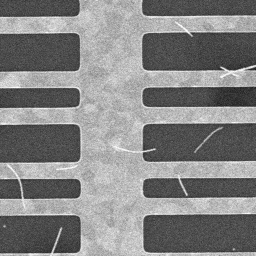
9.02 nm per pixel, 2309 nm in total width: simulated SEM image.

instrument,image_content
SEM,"groups of lines, slits or small figures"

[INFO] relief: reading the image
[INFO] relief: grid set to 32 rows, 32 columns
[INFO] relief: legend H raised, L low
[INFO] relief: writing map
LLLLLLLLLLHHHHHHHHLLLLLLLLLLLLLL
LLLLLLLLLLHHHLHHHHLLLLLLLLLLLLLL
HHHHHHHHHHHHHHHHHHHHHHHHHHHHHHHH
HHHHHHHHHHHHHHHHHHHHHHHHHHHHHHHH
LLLLLLLLLLHHHHHHHHLLLLLLLLLLLLLL
LLLLLLLLLLHHHHHHHHLLLLLLLLLLLLLL
LLLLLLLLLLHHHHHHHHLLLLLLLLLLLLLL
LLLLLLLLLLHHHHHHHHLLLLLLLLLLLLLL
LLLLLLLLLLHHHHHHHHLLLLLLLLLLLLLL
HHHHHHHHHHHHHHHHHHHHHHHHHHHHHHHH
HHHHHHHHHHHHHHHHHHHHHHHHHHHHHHHH
LLLLLLLLLLHHHHHHHHLLLLLLLLLLLLLL
LLLLLLLLLLHHHHHHHHLLLLLLLLLLLLLL
LLLLLLLLLHHHHHHHHHHLLLHHHHHHHHHH
HHHHHHHHHHHHHHHHHHHHHHHHHHHHHHHH
LLLLLLLLLHHHHHHHHHLLLLLLLLLLLLLL
LLLLLLLLLLHHHHHHHHLLLLLLLLLLLLLL
LLLLLLLLLLHHHHHHHHLLLLLLLLLLLLLL
LLLLLLLLLLHHHHHHHHLLLLLLLLLLLLLL
LLLLLLLLLLHHHHHHHHLLLLLLLLLLLLLL
HHHHHHHHHHHHHHHHHHHHHHHHHHHHHHHH
HHHHHHHHHHHHHHHHHHHHHHHHHHHHHHHH
LLLLLLLLLLHHHHHHHHLLLLLLLLLLLLLL
LLLLLLLLLLHHHHHHHHLLLLLLLLLLLLLL
LLLLLLLLLLHHHHHHHHLLLLLLLLLLLLLL
HHHHHHHHHHHHLHHHHHHHHHHHHHHHHHHH
HHHHHHHHHHHHHHHHHHHHHHHHHHHHHHHH
LLLLLLLLLLHHHHHHHHLLLLLLLLLLLLLL
LLLLLLLLLLHHHHHHHHLLLLLLLLLLLLLL
LLLLLLLLLLHHHHHHHHLLLLLLLLLLLLLL
LLLLLLLLLLHHHHHHHHLLLLLLLLLLLLLL
LLLLLLLLLLHHHHHHHHLLLLLLLLLLLLLL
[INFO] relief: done